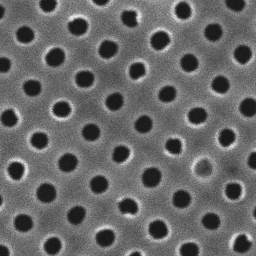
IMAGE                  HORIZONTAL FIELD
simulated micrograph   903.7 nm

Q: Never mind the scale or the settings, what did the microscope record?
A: a regular array of holes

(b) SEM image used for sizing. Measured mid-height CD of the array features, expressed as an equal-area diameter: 64.5 nanometers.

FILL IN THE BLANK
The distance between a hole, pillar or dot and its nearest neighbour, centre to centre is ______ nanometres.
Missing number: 130